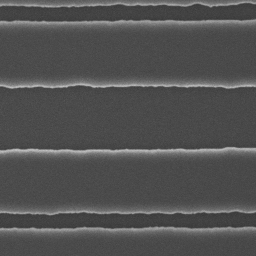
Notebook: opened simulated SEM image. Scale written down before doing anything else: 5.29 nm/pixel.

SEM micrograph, lines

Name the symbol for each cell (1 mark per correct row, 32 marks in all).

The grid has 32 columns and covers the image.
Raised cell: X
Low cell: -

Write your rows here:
XXXXXXXXXXXXXXXXXXXXXXXX-XXXXX--
--------------------------------
--------------------------------
XXXXXXXXXXXXXXXXXXXXXXXXXXXXXXXX
XXXXXXXXXXXXXXXXXXXXXXXXXXXXXXXX
XXXXXXXXXXXXXXXXXXXXXXXXXXXXXXXX
XXXXXXXXXXXXXXXXXXXXXXXXXXXXXXXX
XXXXXXXXXXXXXXXXXXXXXXXXXXXXXXXX
XXXXXXXXXXXXXXXXXXXXXXXXXXXXXXXX
XXXXXXXXXXXXXXXXXXXXXXXXXXXXXXXX
XXXXXXXXXXXXXXXXXXXXXXXXXXXXXXXX
--------------------------------
--------------------------------
--------------------------------
--------------------------------
--------------------------------
--------------------------------
--------------------------------
----------------------------X---
XXXXXXXXXXXXXXXXXXXXXXXXXXXXXXXX
XXXXXXXXXXXXXXXXXXXXXXXXXXXXXXXX
XXXXXXXXXXXXXXXXXXXXXXXXXXXXXXXX
XXXXXXXXXXXXXXXXXXXXXXXXXXXXXXXX
XXXXXXXXXXXXXXXXXXXXXXXXXXXXXXXX
XXXXXXXXXXXXXXXXXXXXXXXXXXXXXXXX
XXXXXXXXXXXXXXXXXXXXXXXXXXXXXXXX
XXXXXXXXXXXXXXXXXXXXXXXXXXXX--XX
--------------------------------
-------------------X----------XX
XXXXXXXXXXXXXXXXXXXXXXXXXXXXXXXX
XXXXXXXXXXXXXXXXXXXXXXXXXXXXXXXX
XXXXXXXXXXXXXXXXXXXXXXXXXXXXXXXX